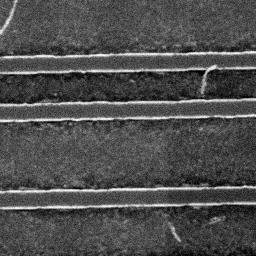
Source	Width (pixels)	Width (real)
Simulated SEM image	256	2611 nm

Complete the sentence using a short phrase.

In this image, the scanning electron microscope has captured lines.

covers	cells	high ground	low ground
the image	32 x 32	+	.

................................
................................
................................
................................
................................
................................
................................
++++++++++++++++++++++++++++++++
++++++++++++++++++++++++++++++++
................................
................................
................................
..............................++
++++++++++++++++++++++++++++++++
+++++++++++++++++++++++++++++++.
................................
................................
................................
................................
................................
................................
................................
................................
.........................+.+++++
++++++++++++++++++++++++++++++++
+++++++++++++++++++++++++++.....
................................
................................
................................
................................
................................
................................